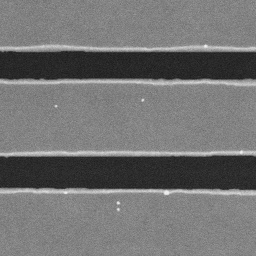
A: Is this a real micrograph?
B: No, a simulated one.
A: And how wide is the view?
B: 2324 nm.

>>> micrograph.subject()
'lines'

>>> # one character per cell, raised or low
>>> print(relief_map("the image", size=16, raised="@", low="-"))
@@@@@@@@@@@@@@@@
@@@@@@@@@@@@@@@@
@@@@@@@@@@@@@@@@
----------------
----------------
@@@@@@@@@@@@@@@@
@@@@@@@@@@@@@@@@
@@@@@@@@@@@@@@@@
@@@@@@@@@@@@@@@@
@@@@@@@@@@@@@@@@
----------------
----------------
@@@@@@@@@@@@@@@@
@@@@@@@@@@@@@@@@
@@@@@@@@@@@@@@@@
@@@@@@@@@@@@@@@@